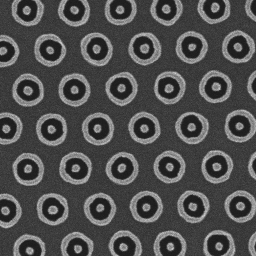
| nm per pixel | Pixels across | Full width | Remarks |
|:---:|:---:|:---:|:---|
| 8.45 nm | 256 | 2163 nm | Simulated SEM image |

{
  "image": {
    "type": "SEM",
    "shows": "a regular array of ring-shaped raised bodies with a dot in the middle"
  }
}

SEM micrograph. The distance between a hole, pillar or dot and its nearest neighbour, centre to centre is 0.382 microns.